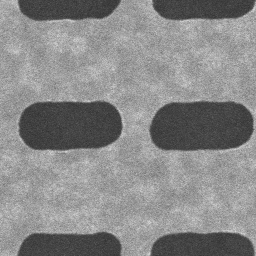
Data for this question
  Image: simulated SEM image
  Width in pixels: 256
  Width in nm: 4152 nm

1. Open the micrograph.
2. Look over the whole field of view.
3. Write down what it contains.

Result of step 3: holes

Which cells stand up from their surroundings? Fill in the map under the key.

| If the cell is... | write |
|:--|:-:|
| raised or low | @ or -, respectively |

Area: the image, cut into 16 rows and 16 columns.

@------@@@------
@@@@@@@@@@@@@@@@
@@@@@@@@@@@@@@@@
@@@@@@@@@@@@@@@@
@@@@@@@@@@@@@@@@
@@@@@@@@@@@@@@@@
@@-----@@@@----@
@-------@-------
@------@@-------
@@@@@@@@@@@@@@@@
@@@@@@@@@@@@@@@@
@@@@@@@@@@@@@@@@
@@@@@@@@@@@@@@@@
@@@@@@@@@@@@@@@@
@@@@@@@@@@@@@@@@
@-------@@------